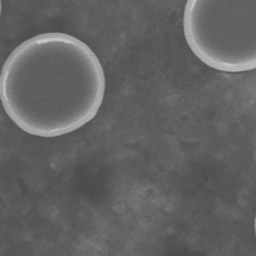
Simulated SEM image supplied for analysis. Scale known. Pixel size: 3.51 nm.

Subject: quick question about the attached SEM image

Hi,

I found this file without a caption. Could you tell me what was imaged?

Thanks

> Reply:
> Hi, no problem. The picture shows raised bodies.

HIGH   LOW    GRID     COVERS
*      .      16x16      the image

............****
............****
..***.......****
.*****.......***
******..........
******..........
******..........
.****...........
................
................
................
................
................
................
................
................